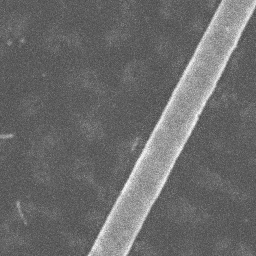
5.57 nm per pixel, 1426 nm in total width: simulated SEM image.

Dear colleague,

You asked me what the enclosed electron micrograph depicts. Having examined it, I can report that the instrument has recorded one or a few lines or trenches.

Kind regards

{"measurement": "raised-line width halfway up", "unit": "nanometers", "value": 183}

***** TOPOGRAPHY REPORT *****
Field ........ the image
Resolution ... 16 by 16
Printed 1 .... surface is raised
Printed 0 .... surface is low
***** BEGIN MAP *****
0000000000000011
0000000000000110
0000000000000110
0000000000001100
0000000000001100
0000000000011000
0000000000011000
0000000000110000
0000000001110000
0000000001100000
0000000011100000
0000000011000000
0000000111000000
0000000110000000
0000001110000000
0000001100000000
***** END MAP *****